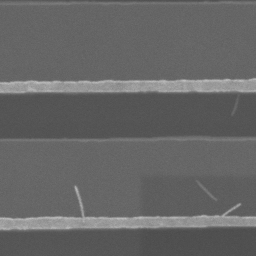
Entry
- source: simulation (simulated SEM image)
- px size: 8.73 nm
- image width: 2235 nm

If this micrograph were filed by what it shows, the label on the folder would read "lines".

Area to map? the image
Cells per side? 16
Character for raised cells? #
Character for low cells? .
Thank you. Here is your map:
################
################
################
################
################
################
................
................
................
################
################
################
################
################
................
................